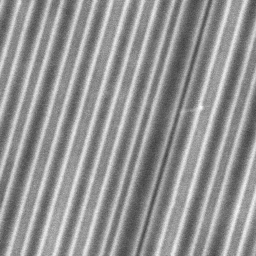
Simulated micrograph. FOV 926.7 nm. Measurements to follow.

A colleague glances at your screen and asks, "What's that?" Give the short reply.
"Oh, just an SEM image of parallel lines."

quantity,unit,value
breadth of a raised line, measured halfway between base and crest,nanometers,65.7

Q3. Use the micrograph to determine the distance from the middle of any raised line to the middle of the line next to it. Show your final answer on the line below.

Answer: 0.106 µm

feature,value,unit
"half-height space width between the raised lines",41.3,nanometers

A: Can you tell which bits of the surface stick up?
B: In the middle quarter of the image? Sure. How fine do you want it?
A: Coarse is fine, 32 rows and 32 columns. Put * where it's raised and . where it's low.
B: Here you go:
...****....****...*****..******.
...****....****...*****..******.
..*****...*****...****...******.
..****....****...*****..******..
..****....****...*****..******..
.*****...*****...*****..******.*
.*****...*****...****...*****..*
.****....****...*****..******..*
.****....****...*****..******.**
*****...*****...****..*******.**
****....****...*****..******..**
****....****...*****..******..**
****...*****...*****..******.***
****...*****...****...*****..***
***....****...*****..******..***
***....****...*****..******.****
***...*****...****...******.****
**....****...*****..******..****
**....****...*****..******..****
**...*****...*****..******.*****
**...*****...****...*****..****.
*....****...*****..******..****.
*....****...*****..******.*****.
*...*****...****...******.*****.
....****...*****..******..****..
....****...*****..******..****..
...*****...*****..******.*****..
...*****...****..******..****...
...****...*****..******..****...
...****...*****..******.*****...
..*****...****...******.*****...
..****...*****..******..****....